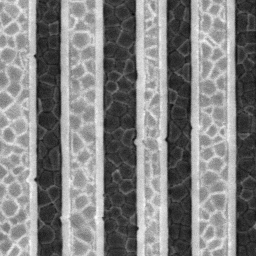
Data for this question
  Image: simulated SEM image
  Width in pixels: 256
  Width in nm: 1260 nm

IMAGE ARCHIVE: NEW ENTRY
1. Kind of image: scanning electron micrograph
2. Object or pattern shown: one or a few lines or trenches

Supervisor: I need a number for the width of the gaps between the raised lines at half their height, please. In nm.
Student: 161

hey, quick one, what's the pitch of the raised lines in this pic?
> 322 nm